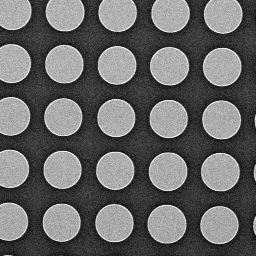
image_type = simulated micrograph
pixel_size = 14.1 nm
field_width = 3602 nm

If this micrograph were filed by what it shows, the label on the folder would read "an array of small figures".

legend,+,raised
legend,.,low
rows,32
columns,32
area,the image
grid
++++..++++...++++..++++...++++..
++++..++++..+++++..+++++..++++..
++++..++++...++++..+++++..++++..
.+.....++....+++....+++...+++...
................................
................................
+++...++++...+++....+++...+++...
++++..++++..+++++..++++...++++..
++++..++++..+++++..+++++.+++++..
+++...++++...++++..++++...++++..
..............+.....++.....++...
................................
+++....++.....+.................
+++...++++...+++...++++...++++..
++++..++++..+++++..++++..+++++..
+++...++++..+++++..++++..+++++..
+++....++....+++...++++...++++..
................................
................................
+++...+++....+++....++....+++...
+++...++++..+++++..++++..+++++..
++++..++++..+++++..++++..+++++..
+++...++++..++++...++++..+++++..
.......+......+.....++....+++...
................................
++..............................
+++...++++..++++...++++...+++...
+++..+++++..+++++..++++..+++++..
+++..+++++..+++++..++++..+++++..
+++...+++....+++...++++...+++...
................................
................................